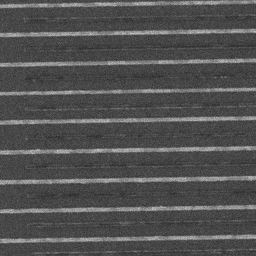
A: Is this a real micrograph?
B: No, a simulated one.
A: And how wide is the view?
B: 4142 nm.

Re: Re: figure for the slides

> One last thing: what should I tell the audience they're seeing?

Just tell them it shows parallel lines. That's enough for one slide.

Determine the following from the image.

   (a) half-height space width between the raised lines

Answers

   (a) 190 nm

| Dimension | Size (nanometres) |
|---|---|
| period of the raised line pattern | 237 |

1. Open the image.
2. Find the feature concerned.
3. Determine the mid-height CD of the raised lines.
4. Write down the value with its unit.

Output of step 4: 0.0445 um